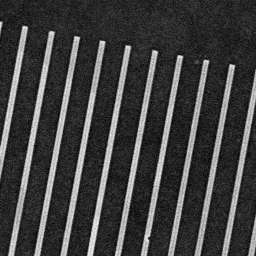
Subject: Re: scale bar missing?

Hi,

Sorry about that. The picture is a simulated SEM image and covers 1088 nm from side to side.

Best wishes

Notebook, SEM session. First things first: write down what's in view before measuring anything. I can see parallel lines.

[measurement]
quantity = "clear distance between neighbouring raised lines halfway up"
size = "21.4 px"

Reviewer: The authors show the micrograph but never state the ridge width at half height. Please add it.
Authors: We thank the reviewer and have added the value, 18.8 nm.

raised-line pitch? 112 nm